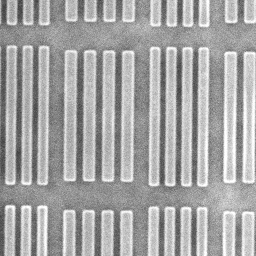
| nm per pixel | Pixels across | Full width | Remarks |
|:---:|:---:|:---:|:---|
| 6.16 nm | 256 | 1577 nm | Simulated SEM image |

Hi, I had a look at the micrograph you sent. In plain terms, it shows groups of lines, slits or small figures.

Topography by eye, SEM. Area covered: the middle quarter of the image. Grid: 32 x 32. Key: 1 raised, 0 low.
11100111001110011000001100110011
11100111001110011000001100110011
11100111001110011000001100110011
11100111001110011000001100110011
11100111001110011000001100110011
11100111001110011000001100110011
11100111001110011000001100110011
11100111001110011000001100110011
11100111001110011000001100110011
11100111001110011000001100110011
11100111001100011000001100110011
11100111001100011000001100110011
11100111001100011000001100110011
11100111001100011000001100110011
11100111001100011000001100110011
11100111001100011000001100110011
11100111001100011000001100110011
11100111001100011000001100110011
11100111001100011000001100110011
11100111001100011000001100110011
11100111001100011000001100110111
11100111001100011000001100110111
11100111001100011000001100110111
11100111001100011000001100110111
11100111001100011000001100110111
11100111001100011000001100110111
11100111001100011000001100110111
11100111001100011000001100110111
11100111001100011000001100110111
00000000000000000000001100110111
00000000000000000000000000000000
00000000000000000000000000000000